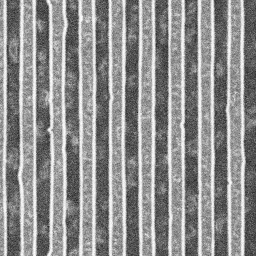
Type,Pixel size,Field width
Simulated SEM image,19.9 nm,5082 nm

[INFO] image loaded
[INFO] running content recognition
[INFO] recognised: parallel lines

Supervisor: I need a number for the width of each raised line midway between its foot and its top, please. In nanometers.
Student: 273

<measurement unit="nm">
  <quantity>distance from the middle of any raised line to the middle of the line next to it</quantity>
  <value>590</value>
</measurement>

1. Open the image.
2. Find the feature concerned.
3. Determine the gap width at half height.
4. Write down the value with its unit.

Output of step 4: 0.31 micrometres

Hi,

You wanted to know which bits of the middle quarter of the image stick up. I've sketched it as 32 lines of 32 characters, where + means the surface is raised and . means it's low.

....++++....+++....+++....++++..
....++++....+++....+++....++++..
....++++....+++....+++....++++..
....++++....+++....+++....++++..
....++++....+++....+++....++++..
....++++....+++....++++...++++..
....++++....+++....++++...++++..
....++++....+++....+++....++++..
....++++....+++....+++....++++..
....++++....+++....+++....++++..
....++++....+++....+++....++++..
....++++....+++....+++....++++..
....++++....+++....+++....++++..
....++++....+++....+++....++++..
....++++....+++....++++...++++..
....++++....+++....++++...++++..
....++++....+++....++++...++++..
....++++....+++....++++...++++..
....++++....+++....++++...++++..
....++++....+++....+++....++++..
....++++....+++....+++....++++..
....+++.....+++....+++....++++..
....++++....+++....+++....++++..
....++++....+++....+++....++++..
....++++....+++....+++....++++..
....++++....+++....+++....++++..
....+++.....+++....+++....++++..
....+++.....+++....+++....++++..
....+++.....+++....+++....++++..
....+++.....+++....+++....++++..
....+++.....+++....+++....++++..
....+++.....+++....+++....++++..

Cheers